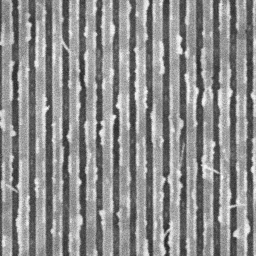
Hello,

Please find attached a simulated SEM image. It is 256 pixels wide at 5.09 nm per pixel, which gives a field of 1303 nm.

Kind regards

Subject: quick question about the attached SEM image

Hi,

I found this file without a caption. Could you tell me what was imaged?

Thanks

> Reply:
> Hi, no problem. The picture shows parallel lines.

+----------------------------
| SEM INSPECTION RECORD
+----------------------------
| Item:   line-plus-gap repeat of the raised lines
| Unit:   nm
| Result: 85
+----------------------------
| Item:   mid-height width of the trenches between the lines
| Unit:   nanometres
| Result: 35.6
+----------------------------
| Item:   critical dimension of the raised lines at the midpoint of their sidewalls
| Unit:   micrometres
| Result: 0.0502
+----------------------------